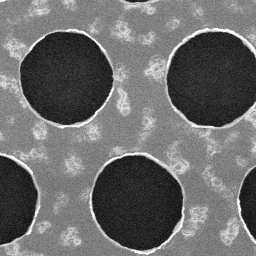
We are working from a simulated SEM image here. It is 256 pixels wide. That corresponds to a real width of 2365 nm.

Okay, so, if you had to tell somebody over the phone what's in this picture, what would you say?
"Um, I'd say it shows holes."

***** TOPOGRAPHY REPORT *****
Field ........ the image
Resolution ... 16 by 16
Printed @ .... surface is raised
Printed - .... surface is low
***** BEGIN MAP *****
@@@@@@@@@@@@@@@@
@@@@@@@@@@@@@@@@
@@@---@@@@@@---@
@@-----@@@@-----
@------@@@@-----
@------@@@------
@@----@@@@@-----
@@@--@@@@@@@---@
@@@@@@@@@@@@@@@@
@@@@@@@@@@@@@@@@
--@@@@----@@@@@@
--@@@@-----@@@@-
--@@@@-----@@@@-
--@@@@-----@@@@-
--@@@@@----@@@@@
@@@@@@@@--@@@@@@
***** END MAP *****